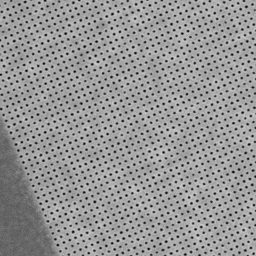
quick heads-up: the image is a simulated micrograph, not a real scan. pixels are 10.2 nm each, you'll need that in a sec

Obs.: a regular array of holes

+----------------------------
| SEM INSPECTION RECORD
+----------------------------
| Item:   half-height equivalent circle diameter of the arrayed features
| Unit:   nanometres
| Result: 25.7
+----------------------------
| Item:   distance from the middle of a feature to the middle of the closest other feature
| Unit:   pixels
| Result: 6.04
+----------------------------